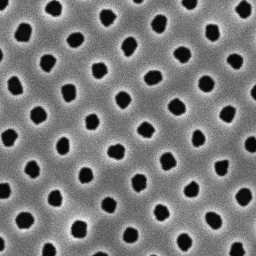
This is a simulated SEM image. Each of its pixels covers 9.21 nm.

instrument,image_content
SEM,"a regular array of holes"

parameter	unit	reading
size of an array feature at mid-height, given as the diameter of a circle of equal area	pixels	17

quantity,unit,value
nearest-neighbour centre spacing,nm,341